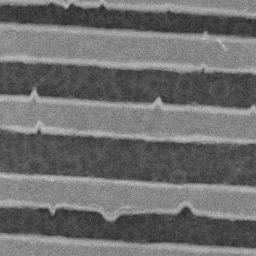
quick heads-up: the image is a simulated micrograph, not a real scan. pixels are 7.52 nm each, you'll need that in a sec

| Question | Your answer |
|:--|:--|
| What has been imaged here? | one or a few lines or trenches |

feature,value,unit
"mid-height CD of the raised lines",225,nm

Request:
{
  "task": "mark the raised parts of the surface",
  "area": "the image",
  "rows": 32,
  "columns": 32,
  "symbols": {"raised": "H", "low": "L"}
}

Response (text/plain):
LLLLLLLHHLHHLHHHHHHHHHHHHHHHHHHH
LLLLLLLLLLLLLLLLLLLLLLLLLLLLHHHH
LLLLLLLLLLLLLLLLLLLLLLLLLLLLLLLL
HHHHLHLLLLLLLLLLLLLLLLLLLLLLLLLL
HHHHHHHHHHHHHHHHHHHHHHLLLHLLLLLL
HHHHHHHHHHHHHHHHHHHHHHHHHHHHHHHH
HHHHHHHHHHHHHHHHHHHHHHHHHHHHHHHH
LLLLLHHHHHHHHHHHHHHHHHHHHHHHHHHH
LLLLLLLLLLLLLLLLLLLLLLLLLLHHHHHH
LLLLLLLLLLLLLLLLLLLLLLLLLLLLLLLL
LLLLLLLLLLLLLLLLLLLLLLLLLLLLLLLL
LLLLLLLLLLLLLLLLLLLLLLLLLLLLLLLL
HHHHHHLLLLLLLLLLLLLLLLLLLLLLLLLL
HHHHHHHHHHHHHHHHHHHHHHLLLLLLLLLL
HHHHHHHHHHHHHHHHHHHHHHHHHHHHHHHH
HHHHHHHHHHHHHHHHHHHHHHHHHHHHHHHH
LLLLLLLLLHHHHHHHHHHHHHHHHHHHHHHH
LLLLLLLLLLLLLLLLLLLLHLLLLLLLLHHH
LLLLLLLLLLLLLLLLLLLLLLLLLLLLLLLL
LLLLLLLLLLLLLLLLLLLLLLLLLLLLLLLL
LLLLLLLLLLLLLLLLLLLLLLLLLLLLLLLL
LLLLLLLLLLLLLLLLLLLLLLLLLLLLLLLL
HHHHHHHHHHHHLLLLLLLLLLLLLLLLLLLL
HHHHHHHHHHHHHHHHHHHHHHHHHHHHHLLL
HHHHHHHHHHHHHHHHHHHHHHHHHHHHHHHH
LLLLHHHHHHHHHHHHHHHHHHHHHHHHHHHH
LLLLLLLLLLLLHHHHHHLLLLLLLHHHHHHH
LLLLLLLLLLLLLLLLLLLLLLLLLLLLLLLL
LLLLLLLLLLLLLLLLLLLLLLLLLLLLLLLL
LLLLLLLLLLLLLLLLLLLLLLLLLLLLLLLL
HHHHHHHHHHHHHHLLLLLLLLLLLLLLLLLL
HHHHHHHHHHHHHHHHHHHHHHHHHHHHHHHH